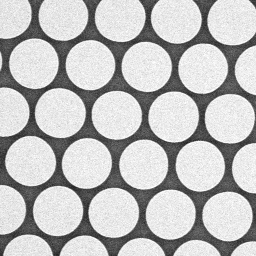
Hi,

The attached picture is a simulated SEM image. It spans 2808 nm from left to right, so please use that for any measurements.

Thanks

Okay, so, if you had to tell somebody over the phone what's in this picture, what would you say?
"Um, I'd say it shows an array of small figures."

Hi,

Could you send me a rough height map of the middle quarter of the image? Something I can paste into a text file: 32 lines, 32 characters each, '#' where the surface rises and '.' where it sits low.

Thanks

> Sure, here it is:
.############.#############..###
.############..############..###
.###########...############..###
.###########...###########...###
..#########.....##########....##
...#######.......########.....##
#..................####........#
###.......######.........#####..
####.....#########.....#########
#####...##########....##########
#####..############...##########
#####..############..###########
#####..############..###########
#####..############..###########
#####..############..###########
####....###########...##########
####....##########....##########
##.......########......#########
...........####.........#######.
...######.........####..........
.#########......########......##
.##########....##########....###
###########....##########....###
############..############..####
############..############..####
############..############..####
############..############..####
###########...############..####
.##########....##########....###
.#########......########.....###
...#####.........######.......##
##........#####.................